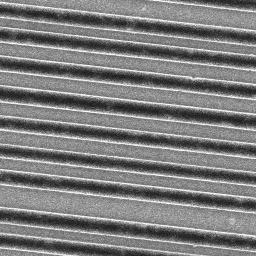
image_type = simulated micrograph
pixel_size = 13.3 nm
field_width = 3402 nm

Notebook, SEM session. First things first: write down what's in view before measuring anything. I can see parallel lines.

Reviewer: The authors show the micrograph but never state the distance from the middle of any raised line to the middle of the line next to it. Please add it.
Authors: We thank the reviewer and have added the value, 386 nm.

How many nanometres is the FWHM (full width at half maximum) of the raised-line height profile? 208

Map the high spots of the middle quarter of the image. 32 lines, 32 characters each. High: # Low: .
#######.........................
################................
#########################.......
################################
.........#######################
..................##############
...........................#####
##..............................
##########......................
###################.............
############################....
.###############################
............####################
.....................###########
..............................##
#######.........................
################................
#########################.......
..##############################
...........#####################
....................############
.............................###
#####...........................
##############..................
#######################.........
...#############################
............####################
.....................###########
##............................##
###########.....................
####################............
############################....